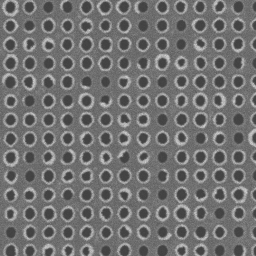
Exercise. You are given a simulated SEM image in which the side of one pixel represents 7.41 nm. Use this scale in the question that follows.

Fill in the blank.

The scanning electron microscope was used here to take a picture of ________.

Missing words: a regular array of holes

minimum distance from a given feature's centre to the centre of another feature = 136 nm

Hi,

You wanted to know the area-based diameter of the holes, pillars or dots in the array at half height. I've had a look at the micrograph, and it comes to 73.9 nanometers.